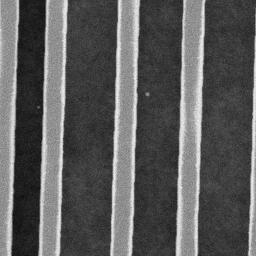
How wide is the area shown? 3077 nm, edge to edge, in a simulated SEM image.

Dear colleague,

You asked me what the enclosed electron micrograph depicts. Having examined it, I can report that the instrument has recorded lines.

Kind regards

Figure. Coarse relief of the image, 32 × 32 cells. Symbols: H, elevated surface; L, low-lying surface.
HHLLLLHHLLLLLLLHHLLLLLLHHHLLLLLL
HHLLLLHHLLLLLLLHHLLLLLLHHLLLLLLL
HHLLLLHHLLLLLLLHHLLLLLLHHLLLLLLL
HHLLLLHHLLLLLLLHHLLLLLLHHLLLLLLL
HHLLLLHHLLLLLLLHHLLLLLLHHLLLLLLL
HHLLLLHHLLLLLLLHHLLLLLLHHLLLLLLL
HHLLLLHHLLLLLLLHHLLLLLLHHLLLLLLL
HHLLLLHHLLLLLLLHHLLLLLLHHLLLLLLL
HHLLLLHHLLLLLLLHHLLLLLLHHLLLLLLL
HHLLLLHHLLLLLLLHHLLLLLLHHLLLLLLL
HHLLLHHHLLLLLLLHHLLLLLLHHLLLLLLL
HHLLLHHHLLLLLLLHHLLLLLLHHLLLLLLL
HHLLLHHHLLLLLLLHHLLLLLLHHLLLLLLL
HHLLLHHHLLLLLLLHHLLLLLLHHLLLLLLL
HHLLLHHHLLLLLLHHHLLLLLLHHLLLLLLL
HHLLLHHHLLLLLLHHHLLLLLLHHLLLLLLL
HHLLLHHHLLLLLLHHHLLLLLHHHLLLLLLL
HHLLLHHHLLLLLLHHHLLLLLHHHLLLLLLL
HHLLLHHHLLLLLLHHHLLLLLHHHLLLLLLL
HHLLLHHHLLLLLLHHHLLLLLHHHLLLLLLL
HHLLLHHHLLLLLLHHHLLLLLHHHLLLLLLL
HHLLLHHHLLLLLLHHHLLLLLHHHLLLLLLL
HHLLLHHHLLLLLLHHHLLLLLHHHLLLLLLH
HHLLLHHHLLLLLLHHHLLLLLHHHLLLLLLH
HHLLLHHHLLLLLLHHHLLLLLHHHLLLLLLH
HHLLLHHHLLLLLLHHHLLLLLHHHLLLLLLH
HLLLLHHHLLLLLLHHHLLLLLHHHLLLLLLH
HLLLLHHHLLLLLLHHHLLLLLHHHLLLLLLH
HLLLLHHHLLLLLLHHHLLLLLHHHLLLLLLH
HLLLLHHLLLLLLLHHHLLLLLHHHLLLLLLH
HLLLLHHLLLLLLLHHLLLLLLHHHLLLLLLH
HLLLLHHLLLLLLLHHLLLLLLHHHLLLLLLH